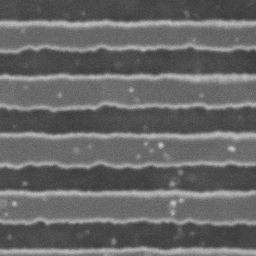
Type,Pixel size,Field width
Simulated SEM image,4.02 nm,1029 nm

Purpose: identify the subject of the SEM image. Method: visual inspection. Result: lines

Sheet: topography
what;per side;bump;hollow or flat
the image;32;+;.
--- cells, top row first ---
................................
................................
................................
++++++++++++++++++++++++++++++++
++++++++++++++++++++++++++++++++
++++++++++++++++++++++++++++++++
++..............................
................................
................................
+++..+++++++++++++++++++++++++++
++++++++++++++++++++++++++++++++
++++++++++++++++++++++++++++++++
++++++++++++++++++++++++++++++++
.+++++++++++....+.........++....
................................
................................
...........................+....
++++++++++++++++++++++++++++++++
++++++++++++++++++++++++++++++++
++++++++++++++++++++++++++++++++
++++++++++++.++++++++++++.++++++
................................
................................
................................
++++++++++++++++++++++++++++++++
++++++++++++++++++++++++++++++++
++++++++++++++++++++++++++++++++
++++++++++++++++++++++++++++++++
................................
................................
................................
++++++++++++++++++++++++++++++++